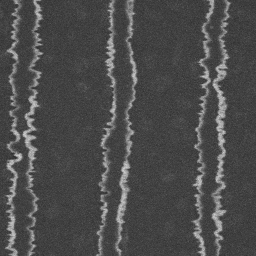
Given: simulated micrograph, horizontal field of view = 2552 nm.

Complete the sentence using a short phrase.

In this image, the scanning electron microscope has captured one or a few lines or trenches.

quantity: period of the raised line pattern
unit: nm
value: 942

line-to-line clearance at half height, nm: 724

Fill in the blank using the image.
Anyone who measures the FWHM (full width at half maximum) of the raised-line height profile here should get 216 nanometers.